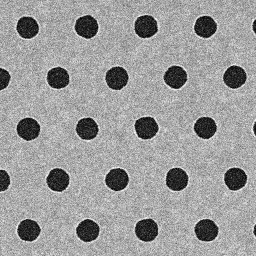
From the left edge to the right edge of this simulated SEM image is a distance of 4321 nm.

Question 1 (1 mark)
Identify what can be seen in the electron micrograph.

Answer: a regular array of holes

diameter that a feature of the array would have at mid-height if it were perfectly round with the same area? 403 nanometers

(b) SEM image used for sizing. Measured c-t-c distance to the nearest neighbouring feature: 987 nanometres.